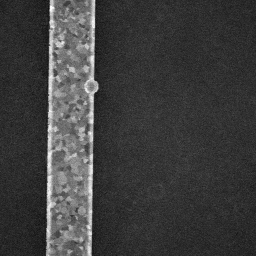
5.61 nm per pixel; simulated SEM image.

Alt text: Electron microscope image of one or a few lines or trenches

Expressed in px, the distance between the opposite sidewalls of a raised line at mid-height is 42.4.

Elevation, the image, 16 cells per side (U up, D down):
DDDUUUDDDDDDDDDD
DDDUUUDDDDDDDDDD
DDDUUUDDDDDDDDDD
DDDUUUDDDDDDDDDD
DDDUUUDDDDDDDDDD
DDDUUUDDDDDDDDDD
DDDUUUDDDDDDDDDD
DDDUUUDDDDDDDDDD
DDDUUUDDDDDDDDDD
DDDUUUDDDDDDDDDD
DDDUUUDDDDDDDDDD
DDDUUUDDDDDDDDDD
DDDUUUDDDDDDDDDD
DDDUUUDDDDDDDDDD
DDDUUUDDDDDDDDDD
DDDUUUDDDDDDDDDD